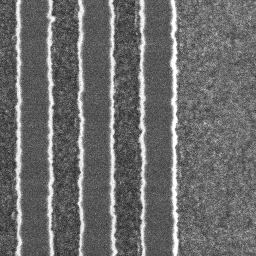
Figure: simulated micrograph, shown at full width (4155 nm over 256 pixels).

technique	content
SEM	parallel lines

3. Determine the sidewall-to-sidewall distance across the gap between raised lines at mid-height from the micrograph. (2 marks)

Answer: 471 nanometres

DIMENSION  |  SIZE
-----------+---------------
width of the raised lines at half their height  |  33 px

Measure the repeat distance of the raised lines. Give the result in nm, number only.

1010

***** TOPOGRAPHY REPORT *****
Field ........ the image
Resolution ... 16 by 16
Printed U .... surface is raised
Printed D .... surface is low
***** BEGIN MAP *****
DUUDDUUDDUUDDDDD
DUUDDUUDDUUDDDDD
DUUDDUUDDUUDDDDD
DUUDDUUDDUUDDDDD
DUUDDUUDDUUDDDDD
DUUDDUUDDUUDDDDD
DUUDDUUDDUUDDDDD
DUUDDUUDDUUDDDDD
DUUDDUUDDUUDDDDD
DUUDDUUDDUUDDDDD
DUUDDUUDDUUDDDDD
DUUDDUUDDUUDDDDD
DUUDDUUDDUUDDDDD
DUUDDUUDDUUDDDDD
DUUDDUUDDUUDDDDD
DUUDDUUDDUUDDDDD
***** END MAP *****